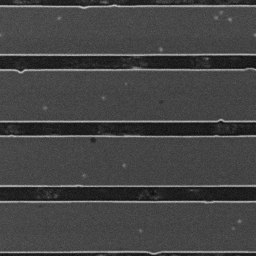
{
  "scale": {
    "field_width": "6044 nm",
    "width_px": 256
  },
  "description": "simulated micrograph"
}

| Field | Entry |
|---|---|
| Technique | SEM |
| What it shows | one or a few lines or trenches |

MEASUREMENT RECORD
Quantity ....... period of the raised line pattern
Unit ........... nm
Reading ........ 1550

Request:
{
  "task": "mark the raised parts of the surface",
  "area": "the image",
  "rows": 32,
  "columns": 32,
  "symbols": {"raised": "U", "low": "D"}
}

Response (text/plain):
DDDDDDDDDDDDDDDDDDDDDDDDDDDDDDDD
UUUUUUUUUUUUUUUUUUUUUUUUUUUUUUUU
UUUUUUUUUUUUUUUUUUUUUUUUUUUUUUUU
UUUUUUUUUUUUUUUUUUUUUUUUUUUUUUUU
UUUUUUUUUUUUUUUUUUUUUUUUUUUUUUUU
UUUUUUUUUUUUUUUUUUUUUUUUUUUUUUUU
UUUUUUUUUUUUUUUUUUUUUUUUUUUUUUUU
DDDDDDDDDDDDDDDDDDDDDDDDDDDDDDDD
DDDDDDDDDDDDDDDDDDDDDDDDDDDDDDDD
UUUUUUUUUUUUUUUUUUUUUUUUUUUUUUUU
UUUUUUUUUUUUUUUUUUUUUUUUUUUUUUUU
UUUUUUUUUUUUUUUUUUUUUUUUUUUUUUUU
UUUUUUUUUUUUUUUUUUUUUUUUUUUUUUUU
UUUUUUUUUUUUUUUUUUUUUUUUUUUUUUUU
UUUUUUUUUUUUUUUUUUUUUUUUUUUUUUUU
DDDDDDDDDDDDDDDDDDDDDDDDDDDDDDDD
DDDDDDDDDDDDDDDDDDDDDDDDDDDDDDDD
UUUUUUUUUUUUUUUUUUUUUUUUUUUUUUUU
UUUUUUUUUUUUUUUUUUUUUUUUUUUUUUUU
UUUUUUUUUUUUUUUUUUUUUUUUUUUUUUUU
UUUUUUUUUUUUUUUUUUUUUUUUUUUUUUUU
UUUUUUUUUUUUUUUUUUUUUUUUUUUUUUUU
UUUUUUUUUUUUUUUUUUUUUUUUUUUUUUUU
DDDDDDDDDDDDDDDDDDDDDDDDDDDDDDDD
DDDDDDDDDDDDDDDDDDDDDDDDDDDDDDDD
UUUUUUUUUUUUUUUUUUUUUUUUUUUUUUUU
UUUUUUUUUUUUUUUUUUUUUUUUUUUUUUUU
UUUUUUUUUUUUUUUUUUUUUUUUUUUUUUUU
UUUUUUUUUUUUUUUUUUUUUUUUUUUUUUUU
UUUUUUUUUUUUUUUUUUUUUUUUUUUUUUUU
UUUUUUUUUUUUUUUUUUUUUUUUUUUUUUUU
DDDDDDDDDDDDUDDDDDUUDDDDDDDDDDDD